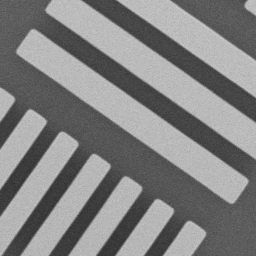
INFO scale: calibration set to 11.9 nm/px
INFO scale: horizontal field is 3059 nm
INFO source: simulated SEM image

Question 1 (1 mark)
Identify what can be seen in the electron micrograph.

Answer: groups of lines, slits or small figures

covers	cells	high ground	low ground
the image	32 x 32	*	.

......*****....*******.........*
......******.....******........*
.......*******....*******.......
.........******.....******......
...**.....*******....*******....
...****....*******....*******...
..******.....******.....******..
...*******....*******....*******
.....******.....******.....*****
......*******....*******....****
........******.....******.....**
*........******.....******.....*
**........*******....*******....
*...........******.....******...
*..**........*******....*******.
..****.........******.....******
..***...........*******....*****
.***...**........*******....****
****..****.........******.....**
***..****..*........*******....*
**...***...***........******....
**..****..***..........*******..
*..****..****..**........******.
...***...***..****........*****.
..***...***...***..........***..
.****..****..****..**...........
****..****..****..****..........
***...***...***...***...........
***..****..***...***...**.......
**..****..****..****..****......
*...***...***..****..****.......
...***...***...***...***........